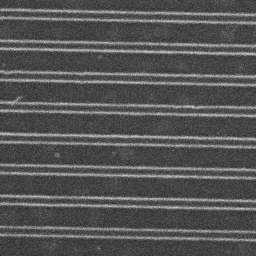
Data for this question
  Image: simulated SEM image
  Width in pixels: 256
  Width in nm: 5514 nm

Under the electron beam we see parallel lines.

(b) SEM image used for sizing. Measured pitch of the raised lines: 668 nanometers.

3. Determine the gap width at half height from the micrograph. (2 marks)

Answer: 0.492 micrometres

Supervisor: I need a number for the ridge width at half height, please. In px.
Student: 8.37